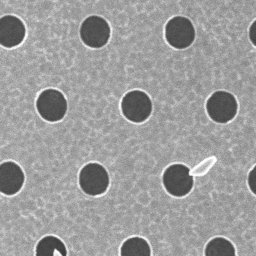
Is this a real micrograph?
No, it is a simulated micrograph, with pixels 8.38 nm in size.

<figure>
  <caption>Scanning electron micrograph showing holes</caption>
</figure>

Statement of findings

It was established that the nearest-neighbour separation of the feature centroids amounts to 0.708 micrometres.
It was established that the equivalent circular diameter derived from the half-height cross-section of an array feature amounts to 0.265 µm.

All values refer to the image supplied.